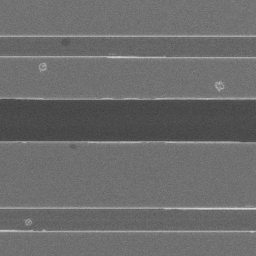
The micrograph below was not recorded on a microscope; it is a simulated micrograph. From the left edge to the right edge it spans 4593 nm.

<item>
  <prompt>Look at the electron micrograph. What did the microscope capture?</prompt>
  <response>lines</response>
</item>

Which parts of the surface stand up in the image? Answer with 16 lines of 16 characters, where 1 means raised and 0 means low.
1111111111111111
1111111111111111
1111111111111111
1111111111111111
1111111111111111
1111111111111111
0000000000000000
0000000000000000
0000000000000000
1111111111111111
1111111111111111
1111111111111111
1111111111111111
1111111111111111
1111111111111111
1111111111111111